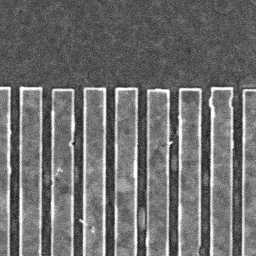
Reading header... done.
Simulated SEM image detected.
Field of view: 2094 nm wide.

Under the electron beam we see parallel lines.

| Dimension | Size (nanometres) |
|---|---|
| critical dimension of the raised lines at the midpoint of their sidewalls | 168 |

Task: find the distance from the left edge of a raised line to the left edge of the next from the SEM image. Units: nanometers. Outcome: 260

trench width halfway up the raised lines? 91 nanometres